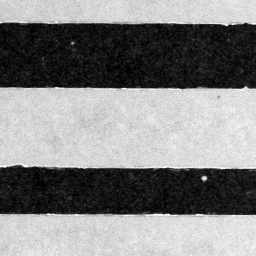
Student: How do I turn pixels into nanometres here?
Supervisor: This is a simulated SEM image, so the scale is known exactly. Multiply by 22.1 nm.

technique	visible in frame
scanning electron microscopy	one or a few lines or trenches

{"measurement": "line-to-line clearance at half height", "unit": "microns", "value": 1.71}